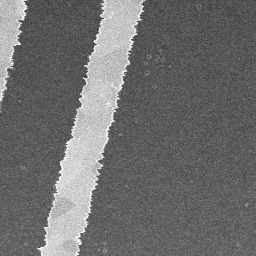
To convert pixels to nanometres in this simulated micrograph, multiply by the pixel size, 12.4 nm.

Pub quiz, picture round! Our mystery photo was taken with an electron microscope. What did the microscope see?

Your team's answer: one or a few lines or trenches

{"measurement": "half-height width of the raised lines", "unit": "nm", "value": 434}